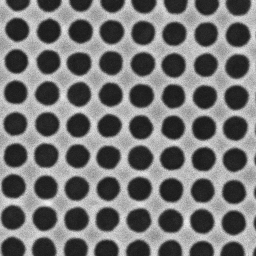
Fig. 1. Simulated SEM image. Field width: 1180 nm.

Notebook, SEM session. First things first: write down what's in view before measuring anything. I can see a regular array of holes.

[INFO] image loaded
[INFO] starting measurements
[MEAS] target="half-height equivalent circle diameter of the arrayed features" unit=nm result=111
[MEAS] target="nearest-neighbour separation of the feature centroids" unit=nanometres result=142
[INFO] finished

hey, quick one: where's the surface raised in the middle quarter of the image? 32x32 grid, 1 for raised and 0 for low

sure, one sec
10000001100000011000000100000001
10000011100000111000001110000011
11100111111001111100011111000011
11111111111111111111111111111111
11110111111111111111111111111111
11000011110000111000011111000111
10000001100000111000001110000011
10000001100000010000001100000011
10000001100000010000000100000011
10000011100000111000001110000011
11100111111011111100011111000111
11111111111111111111111111111111
11101111111011111111111111111111
10000011100000111000011110000111
10000011100000110000001110000011
10000001000000110000001100000011
10000011100000110000001100000011
10000011100001111000001110000011
11111111111111111100011111000111
11111111111111111111111111111111
11000111110011111100111111101111
10000011100001111000011110000111
00000011000000110000001100000011
00000011000000110000001100000011
10000011000000110000001100000011
11000111100001110000011110000111
11111111111111111100111111001111
11111111111111111111111111111111
11000111110001111100111111011111
10000011100000110000001100000111
00000011000000110000001100000011
00000011000000110000001100000011